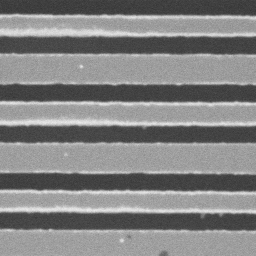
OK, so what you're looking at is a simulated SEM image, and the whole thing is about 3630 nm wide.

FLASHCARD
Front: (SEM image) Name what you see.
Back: lines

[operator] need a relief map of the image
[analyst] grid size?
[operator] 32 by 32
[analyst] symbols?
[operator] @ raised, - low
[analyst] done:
--------------------------------
--------------------------------
@@@@@@@@@@@@@@@@@@@@@@@@@@@@@@@@
@@@@@@@@@@@@@@@@@@@@@@@@@@@@@@@@
-------------@--@@@@-@-@--@@@@@@
--------------------------------
--------------------------------
@@@@@@@@@@@@@@@@@@@@@@@@@@@@@@@@
@@@@@@@@@@@@@@@@@@@@@@@@@@@@@@@@
@@@@@@@@@@@@@@@@@@@@@@@@@@@@@@@@
@-------------@---@---@------@@@
--------------------------------
--------------------------------
@@@@@@@@@@@@@@@@@@@@@@@@@@@@@@@@
@@@@@@@@@@@@@@@@@@@@@@@@@@@@@@@@
@@@@@@@@@@@@@@@@@@@@@@@@@@@@@@@@
--------------------------------
--------------------------------
@@@@@@@@@@@@@@@@@@@@@@@@@@@@@@@@
@@@@@@@@@@@@@@@@@@@@@@@@@@@@@@@@
@@@@@@@@@@@@@@@@@@@@@@@@@@@@@@@@
@@@@@@@@@@@@@@@@@@@@@@@@@@@@@@@@
--------------------------------
--------------------------------
@@@@@@@@@@@@@@@@@@@@@@@@@@@@@@@@
@@@@@@@@@@@@@@@@@@@@@@@@@@@@@@@@
-----------@@@----@@@@@@@@@@@@@@
--------------------------------
--------------------------------
@@@@@@@@@@@@@@@@@@@@@@@@@@@@@@@@
@@@@@@@@@@@@@@@@@@@@@@@@@@@@@@@@
@@@@@@@@@@@@@@@@@@@@@@@@@@@@@@@@